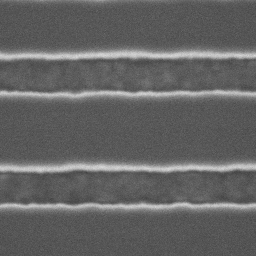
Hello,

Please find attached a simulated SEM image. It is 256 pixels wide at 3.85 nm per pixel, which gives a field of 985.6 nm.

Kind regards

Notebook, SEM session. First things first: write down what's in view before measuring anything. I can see lines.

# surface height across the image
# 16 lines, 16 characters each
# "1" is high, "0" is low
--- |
1111111111111111
1111111111111111
1111111111111111
1111111111111111
0000000000000000
0000000000000000
1111111111111111
1111111111111111
1111111111111111
1111111111111111
1111111111111111
0000000000000000
0000000000000000
1111111111111111
1111111111111111
1111111111111111